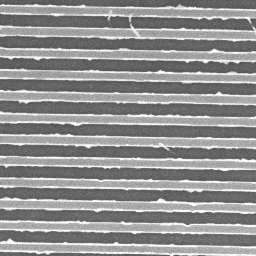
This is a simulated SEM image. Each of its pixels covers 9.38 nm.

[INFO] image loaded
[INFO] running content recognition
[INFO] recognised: parallel lines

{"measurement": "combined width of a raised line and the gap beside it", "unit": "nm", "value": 202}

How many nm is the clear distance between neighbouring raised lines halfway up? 112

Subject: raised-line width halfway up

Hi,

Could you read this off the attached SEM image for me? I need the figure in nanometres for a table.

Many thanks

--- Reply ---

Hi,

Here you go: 94.9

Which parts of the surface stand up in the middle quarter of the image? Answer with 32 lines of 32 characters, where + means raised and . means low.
................................
................................
++++++++++++++++++++++++++++++++
++++++++++++++++++++++++++++++++
.............................+++
................................
................................
++++++++++++++++++.++++......+..
++++++++++++++++++++++++++++++++
..++.++......+++++++++++++++++++
................................
................................
................................
++++++++++++++++++++++++++++++++
++++++++++++++++++++++++++++++++
................................
................................
................................
+++++++++++++++++++++++++.......
++++++++++++++++++++++++++++++++
...+.++..+...+.......+++++++++++
................................
................................
++++++++.........++.............
++++++++++++++++++++++++++++++++
...+++++++++++++++++++++++++++++
................................
................................
................................
++++++++++++++++++++++++++++++++
++++++++++++++++++++++++++++++++
........................+....+++